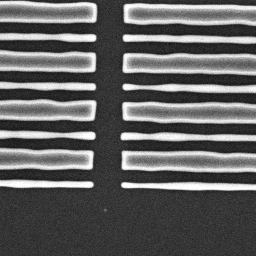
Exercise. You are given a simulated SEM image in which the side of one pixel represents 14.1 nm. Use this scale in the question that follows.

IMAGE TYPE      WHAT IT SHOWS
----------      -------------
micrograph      groups of lines, slits or small figures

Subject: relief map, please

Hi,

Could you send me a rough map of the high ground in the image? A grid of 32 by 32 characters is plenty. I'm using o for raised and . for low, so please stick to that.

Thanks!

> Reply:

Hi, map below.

ooooo.....o.....................
oooooooooooo....oooooooooooooooo
ooooooooooo.....oooooooooooooooo
................................
........oo......................
................................
................................
oooooooooooo....oooooooooooooooo
oooooooooooo....oooooooooooooooo
................................
................................
................................
................................
oooooooooooo....oooooooooooooooo
oooooooooooo....oooooooooooooooo
................................
................................
................................
................................
ooooooooooo....ooooooooooooooooo
ooooooooooo....ooooooooooooooooo
................................
................................
........................o.......
................................
................................
................................
................................
................................
................................
................................
................................